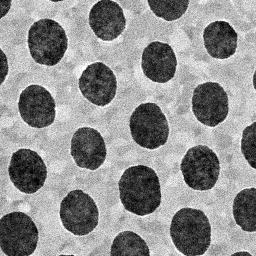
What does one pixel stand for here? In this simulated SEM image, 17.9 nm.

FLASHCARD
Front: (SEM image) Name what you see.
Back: a regular array of holes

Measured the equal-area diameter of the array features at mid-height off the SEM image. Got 747 nanometers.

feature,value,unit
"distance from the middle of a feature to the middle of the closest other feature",64.8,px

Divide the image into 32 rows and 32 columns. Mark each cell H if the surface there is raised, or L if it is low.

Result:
LHHHHHHHHHHHLLLHHHLLLLLLHHHHHHHH
LHHHHHHHHHHLLLLHHHHLLLLHHHHHHHHH
HHHHHLLHHHHLLLLLHHHHHLHHHHHHHHHH
HHHHLLLLHHHLLLLLHHHHHHHHHHLLLHHH
HHHLLLLLHHHHLLLHHHHHHHHHHLLLLLHH
HHHLLLLLHHHHHHHHHHHLLHHHHLLLLLHH
HHHHLLLLHHHHHHHHHHLLLLHHHHLLLHHH
LHHHLLLLHHHHHHHHHHLLLLHHHHHHHHHH
LHHHHHHHHHHLLLHHHHLLLLHHHHHHHHHH
LHHHHHHHHHLLLLHHHHLLLLHHHHHHHHHH
HHHHHHHHHHLLLLLHHHHHHHHHHLLHHHHH
HHHLLLHHHHLLLLLHHHHHHHHHLLLLHHHH
HHLLLLLHHHHLLLHHHHHHHHHHLLLLLHHH
HHLLLLLHHHHHHHHHHLLLHHHHLLLLLHHH
HHHLLLLHHHHHHHHHLLLLLHHHLLLLHHHH
HHHLLLHHHHHHHHHHLLLLLHHHHLLHHHHL
HHHHHHHHHLLLHHHHLLLLLHHHHHHHHHLL
HHHHHHHHHLLLLHHHHLLLLHHHHHHHHHLL
HHHHHHHHHLLLLHHHHHLLHHHHLLHHHHLL
HLLLLHHHHLLLLHHHHHHHHHHLLLLHHHLL
HLLLLLHHHHLLLHHHHHHHHHHLLLLHHHHL
HLLLLLHHHHHHHHHLLLLHHHHLLLLLHHHH
HLLLLLHHHHHHHHHLLLLLHHHLLLLHHHHH
HHLLLHHHHHHHHHHLLLLLHHHHLLLHHHHL
HHHHHHHHLLLHHHHLLLLLHHHHHHHHHLLL
HHHHHHHHLLLLHHHLLLLLHHHHHHHHHLLL
HLLHHHHLLLLLHHHHLLLHHHLLLHHHHLLL
LLLLHHHHLLLLHHHHHHHHHLLLLLHHHLLL
LLLLLHHHLLLLHHHHHHHHHLLLLLHHHHLL
LLLLLHHHHHHHHHLLLHHHHLLLLLHHHHHH
LLLLLHHHHHHHHHLLLLHHHHLLLLHHHHHH
LLLLHHHHHHHHHHLLLLLHHHHLLLHHHHLH